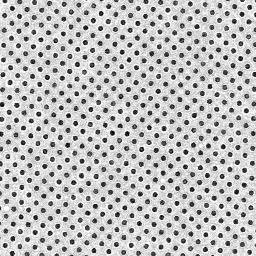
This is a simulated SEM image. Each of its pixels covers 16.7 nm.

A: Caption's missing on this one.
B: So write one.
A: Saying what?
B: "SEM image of a regular array of holes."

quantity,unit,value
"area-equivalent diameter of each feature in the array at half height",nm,97.8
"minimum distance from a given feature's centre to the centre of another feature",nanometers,170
